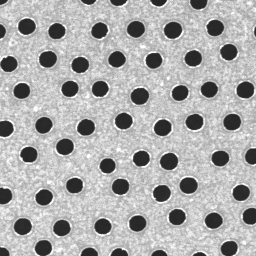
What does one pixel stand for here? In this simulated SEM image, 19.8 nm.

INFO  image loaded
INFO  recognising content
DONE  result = a regular array of holes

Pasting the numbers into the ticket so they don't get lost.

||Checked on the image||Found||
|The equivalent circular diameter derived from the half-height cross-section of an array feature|341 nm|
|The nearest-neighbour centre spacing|0.604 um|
